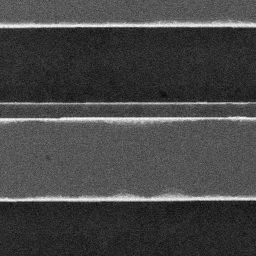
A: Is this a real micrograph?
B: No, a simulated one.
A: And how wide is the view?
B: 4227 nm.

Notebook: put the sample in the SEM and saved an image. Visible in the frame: lines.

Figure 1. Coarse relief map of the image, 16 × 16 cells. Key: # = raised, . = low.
################
################
................
................
................
................
################
################
################
################
################
################
##..............
................
................
................